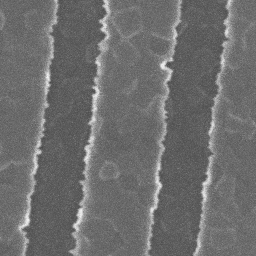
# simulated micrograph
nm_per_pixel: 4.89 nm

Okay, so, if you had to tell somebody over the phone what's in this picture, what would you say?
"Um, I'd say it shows one or a few lines or trenches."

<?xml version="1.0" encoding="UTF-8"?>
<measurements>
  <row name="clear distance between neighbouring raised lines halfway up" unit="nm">234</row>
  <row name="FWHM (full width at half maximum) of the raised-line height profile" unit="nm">352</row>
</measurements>